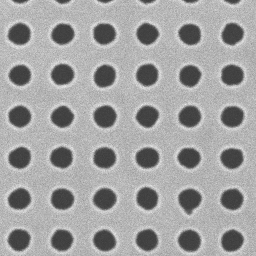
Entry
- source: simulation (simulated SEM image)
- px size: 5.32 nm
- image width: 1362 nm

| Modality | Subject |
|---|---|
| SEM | a regular array of holes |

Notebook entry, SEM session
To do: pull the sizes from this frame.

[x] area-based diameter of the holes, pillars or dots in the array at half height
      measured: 120 nm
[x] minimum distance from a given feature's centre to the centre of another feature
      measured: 219 nanometers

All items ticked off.